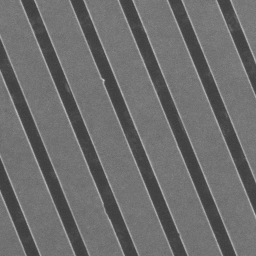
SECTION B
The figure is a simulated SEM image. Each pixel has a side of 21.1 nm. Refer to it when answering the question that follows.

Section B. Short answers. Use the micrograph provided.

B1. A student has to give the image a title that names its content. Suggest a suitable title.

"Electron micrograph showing parallel lines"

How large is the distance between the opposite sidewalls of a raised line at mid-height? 32.3 pixels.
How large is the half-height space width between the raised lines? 276 nm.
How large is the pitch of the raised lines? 45.5 px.